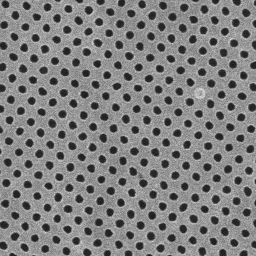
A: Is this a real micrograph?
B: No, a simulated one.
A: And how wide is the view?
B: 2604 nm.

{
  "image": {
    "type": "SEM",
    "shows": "a regular array of holes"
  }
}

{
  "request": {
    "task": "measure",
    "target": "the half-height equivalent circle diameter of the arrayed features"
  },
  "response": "80.3 nanometres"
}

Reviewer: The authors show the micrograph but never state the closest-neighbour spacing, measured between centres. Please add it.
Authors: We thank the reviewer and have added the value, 146 nanometers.